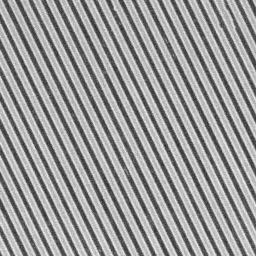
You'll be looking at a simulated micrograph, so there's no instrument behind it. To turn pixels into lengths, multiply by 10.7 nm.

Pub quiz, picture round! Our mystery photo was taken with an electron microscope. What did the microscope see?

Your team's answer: parallel lines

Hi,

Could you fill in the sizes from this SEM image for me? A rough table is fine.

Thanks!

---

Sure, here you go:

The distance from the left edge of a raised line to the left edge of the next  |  124 nanometers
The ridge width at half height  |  60 nanometres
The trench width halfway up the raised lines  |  60 nm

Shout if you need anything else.